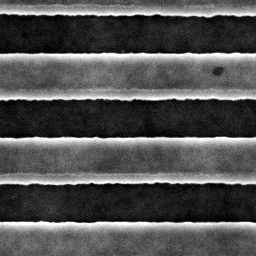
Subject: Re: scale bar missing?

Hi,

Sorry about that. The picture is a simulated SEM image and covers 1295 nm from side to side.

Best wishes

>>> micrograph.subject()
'lines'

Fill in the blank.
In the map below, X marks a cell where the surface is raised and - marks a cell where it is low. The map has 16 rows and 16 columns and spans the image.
XXXXXXXXXXXXXXXX
----------------
----------------
XXXXXXXXXXXXXXXX
XXXXXXXXXXXXXXXX
XXXXXXXXXXXXXXXX
----------------
----------------
----------------
XXXXXXXXXXXXXXXX
XXXXXXXXXXXXXXXX
---X------------
----------------
----------------
XXXXXXXXXXXXXXXX
XXXXXXXXXXXXXXXX